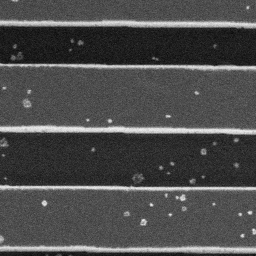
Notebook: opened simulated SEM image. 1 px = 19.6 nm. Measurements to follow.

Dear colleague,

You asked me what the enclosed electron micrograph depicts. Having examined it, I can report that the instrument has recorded lines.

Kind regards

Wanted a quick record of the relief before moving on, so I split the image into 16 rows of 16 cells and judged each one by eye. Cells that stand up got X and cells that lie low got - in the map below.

XXXXXXXXXXXXXXXX
---XXXXXXXXXXXXX
----------------
----------------
XXXXXXXXXXXXXXXX
XXXXXXXXXXXXXXXX
XXXXXXXXXXXXXXXX
XXXXXXXXXXXXXXXX
----------------
----------------
----------------
----------------
XXXXXXXXXXXXXXXX
XXXXXXXXXXXXXXXX
XXXXXXXXXXXXXXXX
XXXXXXXXXXXXXXXX